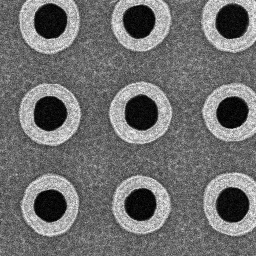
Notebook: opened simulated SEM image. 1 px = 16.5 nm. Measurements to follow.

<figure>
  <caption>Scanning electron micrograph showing ring-shaped raised bodies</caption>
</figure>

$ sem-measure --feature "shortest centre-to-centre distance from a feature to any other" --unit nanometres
1490